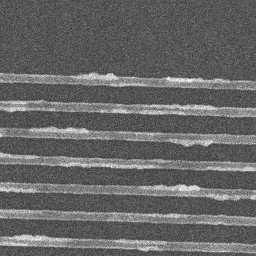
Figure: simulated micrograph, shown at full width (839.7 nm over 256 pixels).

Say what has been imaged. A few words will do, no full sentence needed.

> parallel lines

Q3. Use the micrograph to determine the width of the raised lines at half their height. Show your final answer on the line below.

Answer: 0.0279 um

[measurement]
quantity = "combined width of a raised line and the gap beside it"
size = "89.2 nm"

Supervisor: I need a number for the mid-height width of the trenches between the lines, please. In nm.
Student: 61.5